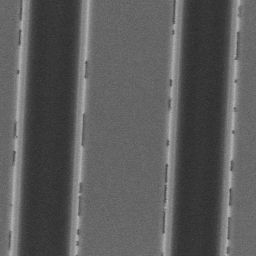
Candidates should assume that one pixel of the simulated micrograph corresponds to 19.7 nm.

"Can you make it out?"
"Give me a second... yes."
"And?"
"one or a few lines or trenches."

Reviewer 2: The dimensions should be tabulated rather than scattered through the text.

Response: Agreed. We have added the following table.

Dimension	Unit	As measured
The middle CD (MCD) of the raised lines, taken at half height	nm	1860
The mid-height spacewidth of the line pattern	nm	1130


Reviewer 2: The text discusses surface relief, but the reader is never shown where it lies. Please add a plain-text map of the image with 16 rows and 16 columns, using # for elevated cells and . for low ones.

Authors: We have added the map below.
##...######....#
##...######....#
##...######....#
#....######....#
#....######...##
#....######...##
#....######...##
#....######...##
#....######...##
#....######...##
#....######...##
#....######...##
#....######...##
#....######...##
#....#####....##
#....#####....##